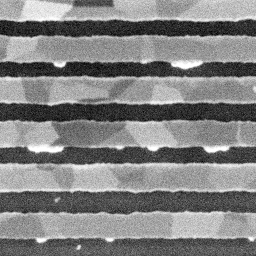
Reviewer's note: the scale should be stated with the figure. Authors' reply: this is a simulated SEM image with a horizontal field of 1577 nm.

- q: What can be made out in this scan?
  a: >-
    lines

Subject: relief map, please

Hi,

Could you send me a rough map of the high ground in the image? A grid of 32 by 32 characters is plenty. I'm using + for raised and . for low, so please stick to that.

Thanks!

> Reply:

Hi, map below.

++++++++++++++++++++++++++++++++
++++++++++++++++++++++++++++++++
.++++++++++.++.++++...++++++++..
................................
..................+.............
++++++++++++++++++++++++++++++++
++++++++++++++++++++++++++++++++
++++++++++++++++++++++++++++++++
................................
................................
++++++++++++++++++++++++++++++++
++++++++++++++++++++++++++++++++
++++++++++++++++++++++++++++++++
................................
................................
++++++++++++++++++++++++++++++++
++++++++++++++++++++++++++++++++
++++++++++++++++++++++++++++++++
................................
................................
.+...........+.++.+++++++++...++
++++++++++++++++++++++++++++++++
++++++++++++++++++++++++++++++++
++++++++++++++++++++++++++++++++
................................
................................
................................
++++++++++++++++++++++++++++++++
++++++++++++++++++++++++++++++++
++++++++++++++++++++++++++++++++
................................
................................